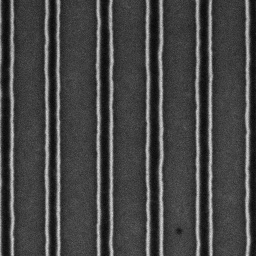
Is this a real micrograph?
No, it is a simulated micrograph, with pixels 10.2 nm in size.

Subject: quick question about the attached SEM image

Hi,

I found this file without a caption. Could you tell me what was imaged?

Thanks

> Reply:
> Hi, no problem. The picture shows parallel lines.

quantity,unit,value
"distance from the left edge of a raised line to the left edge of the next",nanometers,517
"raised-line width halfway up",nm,136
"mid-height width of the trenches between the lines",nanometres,367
